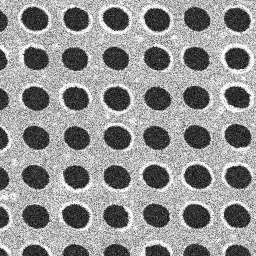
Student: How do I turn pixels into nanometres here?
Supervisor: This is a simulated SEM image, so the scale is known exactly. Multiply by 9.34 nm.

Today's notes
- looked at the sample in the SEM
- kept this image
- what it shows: a regular array of holes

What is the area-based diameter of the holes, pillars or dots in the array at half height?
0.238 um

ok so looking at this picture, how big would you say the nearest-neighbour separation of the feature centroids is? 366 nanometers